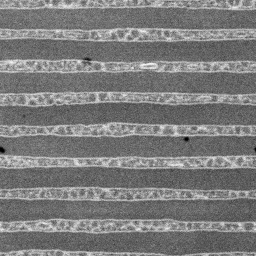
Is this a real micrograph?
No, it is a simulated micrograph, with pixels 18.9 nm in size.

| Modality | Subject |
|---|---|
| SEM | parallel lines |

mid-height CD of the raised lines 422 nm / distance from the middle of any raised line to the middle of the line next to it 31.9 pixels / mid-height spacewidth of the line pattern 0.186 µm